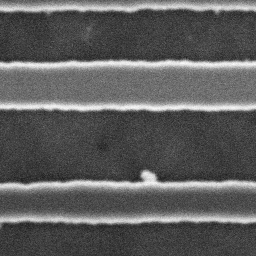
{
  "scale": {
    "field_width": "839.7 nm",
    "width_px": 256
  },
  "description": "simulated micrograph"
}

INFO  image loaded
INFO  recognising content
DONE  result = lines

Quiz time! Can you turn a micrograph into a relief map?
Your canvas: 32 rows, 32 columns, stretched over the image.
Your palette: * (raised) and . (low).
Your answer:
********************************
................................
................................
................................
................................
................................
................................
................................
********************************
********************************
********************************
********************************
********************************
********************************
................................
................................
................................
................................
................................
................................
................................
................................
................................
********************************
********************************
********************************
********************************
***.*******************.**.*****
................................
................................
................................
................................